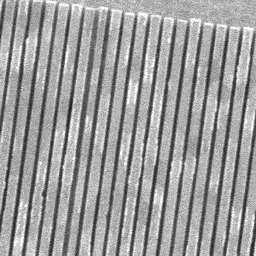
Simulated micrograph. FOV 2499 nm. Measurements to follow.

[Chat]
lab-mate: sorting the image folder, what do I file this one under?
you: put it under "parallel lines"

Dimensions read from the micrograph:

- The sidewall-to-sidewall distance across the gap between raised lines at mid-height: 41.1 nm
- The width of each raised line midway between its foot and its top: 0.0906 um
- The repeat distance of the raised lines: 130 nm